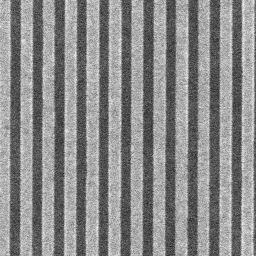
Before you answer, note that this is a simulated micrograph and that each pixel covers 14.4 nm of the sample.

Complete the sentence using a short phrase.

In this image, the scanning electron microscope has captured parallel lines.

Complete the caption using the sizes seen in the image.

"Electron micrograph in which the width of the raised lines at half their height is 155 nanometres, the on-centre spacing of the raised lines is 319 nanometres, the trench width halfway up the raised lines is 169 nanometers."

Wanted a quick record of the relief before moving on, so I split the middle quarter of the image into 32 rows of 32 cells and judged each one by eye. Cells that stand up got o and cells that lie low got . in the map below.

.oo...oo....oo...ooo...oo...ooo.
.oo...oo....oo...ooo...oo...ooo.
.oo...oo....oo...ooo...oo...ooo.
.oo...oo....oo...ooo...oo...ooo.
.oo...oo....oo...ooo...oo...ooo.
.oo...oo....oo...ooo...oo...ooo.
.oo...oo....oo...ooo...oo...ooo.
.oo...oo....oo...ooo...oo...ooo.
.oo...oo....oo...ooo...oo...ooo.
.oo...oo....oo...ooo...oo...ooo.
.oo...oo....oo...ooo...oo...ooo.
.oo...oo....oo...ooo...oo...ooo.
.oo...oo....oo...ooo...oo...ooo.
.oo...oo....oo...ooo...oo...ooo.
.oo...oo....oo...ooo...oo...ooo.
.oo...oo....oo...ooo...oo...ooo.
.oo...oo....oo...ooo...oo...ooo.
.oo...oo....oo...ooo..ooo...ooo.
.oo...oo....oo...ooo..ooo...ooo.
.oo...oo...ooo...ooo..ooo...ooo.
.oo...oo...ooo...ooo..ooo...ooo.
.oo...oo...ooo...ooo..ooo...ooo.
ooo...oo...ooo...ooo..ooo...ooo.
ooo...oo...ooo...ooo..ooo...ooo.
ooo...oo...ooo...ooo..ooo...ooo.
ooo...oo...ooo...ooo..ooo...ooo.
ooo...oo...ooo...ooo..ooo...ooo.
ooo...oo...ooo...ooo..ooo...ooo.
ooo...oo...ooo...ooo..ooo...ooo.
ooo...oo...ooo...ooo..ooo...ooo.
ooo...oo...ooo...ooo..ooo...ooo.
ooo...oo...ooo...ooo..ooo...ooo.